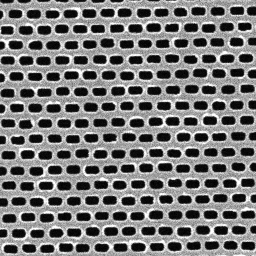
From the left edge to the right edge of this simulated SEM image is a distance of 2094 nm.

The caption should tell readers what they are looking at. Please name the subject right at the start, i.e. a regular array of holes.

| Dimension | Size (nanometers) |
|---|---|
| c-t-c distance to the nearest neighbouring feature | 142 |